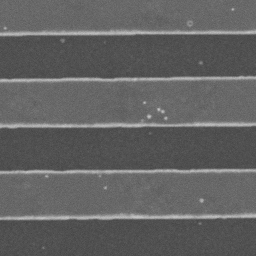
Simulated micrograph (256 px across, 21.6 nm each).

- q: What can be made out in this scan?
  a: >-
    lines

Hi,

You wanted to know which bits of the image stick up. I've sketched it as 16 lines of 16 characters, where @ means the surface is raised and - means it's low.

@@@@@@@@@@@@@@@@
@@@@@@@@@@@@@@@@
----------------
----------------
----------------
@@@@@@@@@@@@@@@@
@@@@@@@@@@@@@@@@
@@@@@@@@@@@@@@@@
----------------
----------------
----------------
@@@@@@@@@@@@@@@@
@@@@@@@@@@@@@@@@
@@@@@@@@@@@@@@@@
----------------
----------------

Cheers